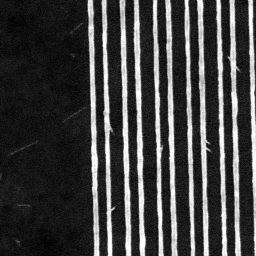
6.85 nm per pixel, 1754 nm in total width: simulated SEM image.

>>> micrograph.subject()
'parallel lines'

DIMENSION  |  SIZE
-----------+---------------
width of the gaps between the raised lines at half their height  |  0.0766 um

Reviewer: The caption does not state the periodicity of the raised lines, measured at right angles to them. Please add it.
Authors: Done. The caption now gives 108 nm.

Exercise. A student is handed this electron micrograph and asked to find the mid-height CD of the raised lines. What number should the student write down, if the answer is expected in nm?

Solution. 29.1